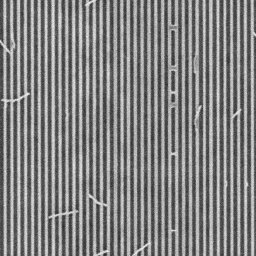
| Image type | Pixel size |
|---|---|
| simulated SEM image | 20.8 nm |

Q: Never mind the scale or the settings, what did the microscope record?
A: parallel lines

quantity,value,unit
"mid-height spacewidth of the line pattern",88.5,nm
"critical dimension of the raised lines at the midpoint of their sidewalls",0.0521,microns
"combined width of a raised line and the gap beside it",143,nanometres